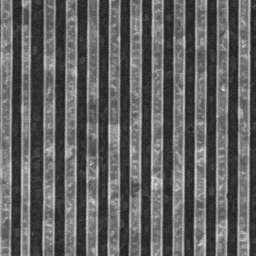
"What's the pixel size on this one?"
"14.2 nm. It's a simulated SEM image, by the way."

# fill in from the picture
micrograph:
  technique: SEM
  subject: parallel lines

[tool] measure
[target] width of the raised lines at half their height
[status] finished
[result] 138 nanometres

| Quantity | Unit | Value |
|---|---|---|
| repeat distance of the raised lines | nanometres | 307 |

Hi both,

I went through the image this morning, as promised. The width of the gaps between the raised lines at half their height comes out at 11.6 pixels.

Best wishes